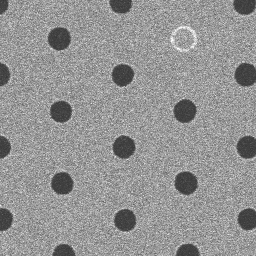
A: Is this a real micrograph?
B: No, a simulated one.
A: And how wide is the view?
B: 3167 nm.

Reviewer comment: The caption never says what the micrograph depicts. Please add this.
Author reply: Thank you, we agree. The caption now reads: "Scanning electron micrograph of a regular array of holes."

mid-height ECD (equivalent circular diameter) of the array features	288	nm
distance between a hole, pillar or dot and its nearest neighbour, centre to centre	0.885	um